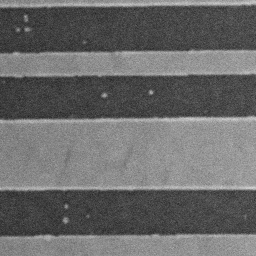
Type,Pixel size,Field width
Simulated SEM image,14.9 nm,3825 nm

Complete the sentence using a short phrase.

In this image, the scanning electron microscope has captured lines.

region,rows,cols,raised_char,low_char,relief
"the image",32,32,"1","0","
11111111111111111100000000000000
00000000000000000000000000000000
00000000000000000000000000000000
00000000000000000000000000000000
00000000000000000000000000000000
00000000000000000000000000000000
00000000000000000000000001111111
11111111111111111111111111111111
11111111111111111111111111111111
00100000000000000000000000000000
00000000000000000000000000000000
00000000000000000000000000000000
00000000000000000000000000000000
00000000000000000000000000000000
00000000000000000000000000000000
11111111111111111111111111111111
11111111111111111111111111111111
11111111111111111111111111111111
11111111111111111111111111111111
11111111111111111111111111111111
11111111111111111111111111111111
11111111111111111111111111111111
11111111111111111111111111111111
10100000000010001000000000000000
00000000000000000000000000000000
00000000000000000000000000000000
00000000000000000000000000000000
00000000000000000000000000000000
00000000000000000000000000000000
00000000000000000000001111111111
11111111111111111111111111111111
11111111111111111111111111111111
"